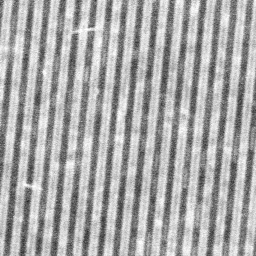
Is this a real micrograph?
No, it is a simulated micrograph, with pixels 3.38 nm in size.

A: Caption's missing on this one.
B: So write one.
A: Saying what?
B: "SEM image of parallel lines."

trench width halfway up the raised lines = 29.4 nanometers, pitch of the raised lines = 52.5 nm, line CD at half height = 0.0235 µm